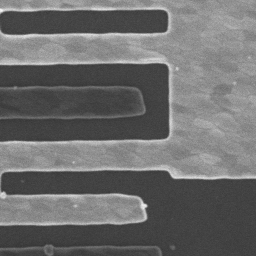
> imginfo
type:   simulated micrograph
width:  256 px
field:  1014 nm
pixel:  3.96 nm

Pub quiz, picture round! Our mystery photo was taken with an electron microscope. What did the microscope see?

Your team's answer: wiring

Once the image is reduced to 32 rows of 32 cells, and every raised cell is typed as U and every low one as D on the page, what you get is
UUUUUUUUUUUUUUUUUUUUUUUUUUUUUUUU
DDDDDDDDDDDDDDDDDDDDDUUUUUUUUUUU
DDDDDDDDDDDDDDDDDDDDDUUUUUUUUUUU
DDDDDDDDDDDDDDDDDDDDDUUUUUUUUUUU
UUUUUUUUUUUUUUUUUUUUUUUUUUUUUUUU
UUUUUUUUUUUUUUUUUUUUUUUUUUUUUUUU
UUUUUUUUUUUUUUUUUUUUUUUUUUUUUUUU
UUUUUUUUUUUUUUUUUUUUUUUUUUUUUUUU
DDDDDDDDDDDDDDDDDDDDDUUUUUUUUUUU
DDDDDDDDDDDDDDDDDDDDDUUUUUUUUUUU
DDDDDDDDDDDDDDDDDDDDDUUUUUUUUUUU
UUUUUUUUUUUUUUUUUUDDDUUUUUUUUUUU
UUUUUUUUUUUUUUUUUUDDDUUUUUUUUUUU
UUUUUUUUUUUUUUUUUUDDDUUUUUUUUUUU
UUUUUUUUUUUUUUUUUDDDDUUUUUUUUUUU
DDDDDDDDDDDDDDDDDDDDDUUUUUUUUUUU
DDDDDDDDDDDDDDDDDDDDDUUUUUUUUUUU
DDDDDDDDDDDDDDDDDDDDUUUUUUUUUUUU
UUUUUUUUUUUUUUUUUUUUUUUUUUUUUUUU
UUUUUUUUUUUUUUUUUUUUUUUUUUUUUUUU
UUUUUUUUUUUUUUUUUUUUUUUUUUUUUUUU
UDDDDDDDDDDDDDDDDDDDDUUUUUUUUUUU
DDDDDDDDDDDDDDDDDDDDDDDDDDDDDDDD
DDDDDDDDDDDDDDDDDDDDDDDDDDDDDDDD
UUUUUUUUUUUUUUUUDDDDDDDDDDDDDDDD
UUUUUUUUUUUUUUUUUUDDDDDDDDDDDDDD
UUUUUUUUUUUUUUUUUUDDDDDDDDDDDDDD
UUUUUUUUUUUUUUUUUUDDDDDDDDDDDDDD
DDDDDDDDDDDDDDDDDDDDDDDDDDDDDDDD
DDDDDDDDDDDDDDDDDDDDDDDDDDDDDDDD
DDDDDDDDDDDDDDDDDDDDDDDDDDDDDDDD
UUUUUUUUUUUUUUUUUUUUDDDDDDDDDDDD